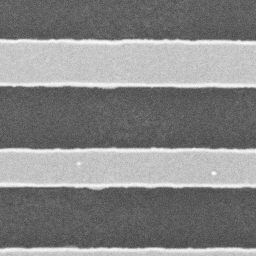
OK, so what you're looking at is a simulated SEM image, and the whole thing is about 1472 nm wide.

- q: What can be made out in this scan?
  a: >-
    lines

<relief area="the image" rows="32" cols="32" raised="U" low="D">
DDDDDDDDDDDDDDDDDDDDDDDDDDDDDDDD
DDDDDDDDDDDDDDDDDDDDDDDDDDDDDDDD
DDDDDDDDDDDDDDDDDDDDDDDDDDDDDDDD
DDDDDDDDDDDDDDDDDDDDDDDDDDDDDDDD
DDDDDDDDDDDDDDDDDDDDDDDDDDDDDDDD
UUUUUUUUUUUUUUUUUUUUUUUUUUUUUUUU
UUUUUUUUUUUUUUUUUUUUUUUUUUUUUUUU
UUUUUUUUUUUUUUUUUUUUUUUUUUUUUUUU
UUUUUUUUUUUUUUUUUUUUUUUUUUUUUUUU
UUUUUUUUUUUUUUUUUUUUUUUUUUUUUUUU
UUUUUUUUUUUUUUUUUUUUUUUUUUUUUUUU
DDDDDDDDDDDDDDDDDDDDDDDDDDDDDDDD
DDDDDDDDDDDDDDDDDDDDDDDDDDDDDDDD
DDDDDDDDDDDDDDDDDDDDDDDDDDDDDDDD
DDDDDDDDDDDDDDDDDDDDDDDDDDDDDDDD
DDDDDDDDDDDDDDDDDDDDDDDDDDDDDDDD
DDDDDDDDDDDDDDDDDDDDDDDDDDDDDDDD
DDDDDDDDDDDDDDDDDDDDDDDDDDDDDDDD
DDDDDDDDDDDDDDDDDDDDDDDDDDDDDDDD
UUUUUUUUUUUUUUUUUUUUUUUUUUUUUUUU
UUUUUUUUUUUUUUUUUUUUUUUUUUUUUUUU
UUUUUUUUUUUUUUUUUUUUUUUUUUUUUUUU
UUUUUUUUUUUUUUUUUUUUUUUUUUUUUUUU
DDDDDDDDDDDDDDDDDDDDDDDDDDDDDDDD
DDDDDDDDDDDDDDDDDDDDDDDDDDDDDDDD
DDDDDDDDDDDDDDDDDDDDDDDDDDDDDDDD
DDDDDDDDDDDDDDDDDDDDDDDDDDDDDDDD
DDDDDDDDDDDDDDDDDDDDDDDDDDDDDDDD
DDDDDDDDDDDDDDDDDDDDDDDDDDDDDDDD
DDDDDDDDDDDDDDDDDDDDDDDDDDDDDDDD
DDDDDDDDDDDDDDDDDDDDDDDDDDDDDDDD
UUUUUUUUUUUUUUUUUUUUUUUUUUUUUUUU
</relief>